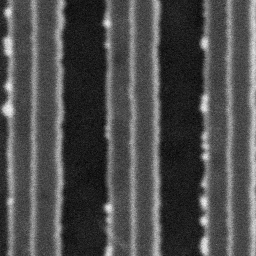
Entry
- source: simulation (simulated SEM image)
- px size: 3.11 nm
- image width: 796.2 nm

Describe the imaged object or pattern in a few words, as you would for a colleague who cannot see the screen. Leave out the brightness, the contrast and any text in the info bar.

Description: lines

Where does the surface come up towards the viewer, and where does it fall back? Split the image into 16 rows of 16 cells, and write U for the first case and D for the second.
UUUUDDDUUUDDDUUU
DUUUDDDUUUDDDUUU
UUUUDDDUUUDDDUUU
DUUUDDDUUUDDDUUU
DUUUDDDUUUDDDUUU
UUUUDDDUUUDDDUUU
UUUUDDDUUUDDDUUU
DUUUDDDUUUDDDUUU
DUUUDDDUUUDDDUUU
DUUUDDDUUUDDDUUU
DUUUDDDUUUDDDUUU
DUUUDDDUUUDDDUUU
DUUUDDDUUUDDDUUU
DUUUDDDUUUDDDUUU
DUUUDDDUUUDDDUUU
DUUUDDDUUUDDDUUU